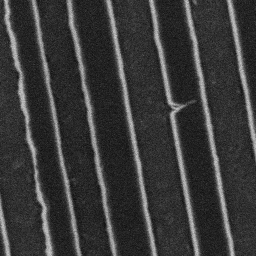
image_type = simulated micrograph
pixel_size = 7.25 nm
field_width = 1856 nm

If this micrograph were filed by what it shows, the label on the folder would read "one or a few lines or trenches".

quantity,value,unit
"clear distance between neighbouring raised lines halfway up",293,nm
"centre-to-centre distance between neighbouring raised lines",534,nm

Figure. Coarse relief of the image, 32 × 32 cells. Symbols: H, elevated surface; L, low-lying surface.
LHHHLLLLLHHHHHLLLLLHHHHLLLLLLHHH
LHHHHLLLLHHHHHLLLLLHHHHHLLLLLHHH
LHHHHLLLLHHHHHLLLLLHHHHHLLLLLHHH
LHHHHLLLLHHHHHLLLLLHHHHHLLLLLHHH
LHHHHLLLLHHHHHLLLLLHHHHHLLLLLHHH
LLHHHLLLLLHHHHHLLLLLHHHHLLLLLLHH
LLHHHLLLLLHHHHHLLLLLHHHHHLLLLLHH
LLHHHHLLLLHHHHHLLLLLHHHHHLLLLLHH
LLHHHHLLLLHHHHHLLLLLHHHHHLLLLLHH
LLLHHHLLLLHHHHHLLLLLLHHHHLLLLLHH
LLLHHHLLLLHHHHHHLLLLLHHHHLLLLLHH
LLLHHHLLLLLHHHHHLLLLLHHHHLLLLLLH
LLLHHHHLLLLHHHHHLLLLLHHHHHLLLLLH
LLLHHHHLLLLHHHHHLLLLLLHHHHLLLLLH
LLLHHHHLLLLHHHHHLLLLLLHHHHLLLLLH
LLLHHHHLLLLHHHHHLLLLLLHHHHLLLLLH
LLLHHHHLLLLLHHHHHLLLLLHHHHLLLLLL
LLLLHHHLLLLLHHHHHLLLLLHHHHHLLLLL
LLLLHHHHLLLLHHHHHLLLLLHHHHHLLLLL
LLLLHHHHLLLLHHHHHLLLLLHHHHHLLLLL
LLLLHHHHLLLLHHHHHLLLLLLHHHHLLLLL
LLLLHHHHLLLLHHHHHHLLLLLHHHHLLLLL
LLLLHHHHLLLLLHHHHHLLLLLHHHHLLLLL
LLLLLHHHHLLLLHHHHHLLLLLHHHHHLLLL
LLLLLHHHHLLLLHHHHHLLLLLHHHHHLLLL
LLLLLHHHHLLLLHHHHHLLLLLLHHHHLLLL
LLLLLHHHHLLLLHHHHHLLLLLLHHHHLLLL
LLLLLHHHHLLLLHHHHHHLLLLLHHHHLLLL
HLLLLLHHHLLLLLHHHHHLLLLLHHHHLLLL
HLLLLLHHHHLLLLHHHHHLLLLLHHHHHLLL
HLLLLLHHHHLLLLHHHHHLLLLLHHHHHLLL
HLLLLLHHHHLLLLHHHHHLLLLLLHHHHLLL